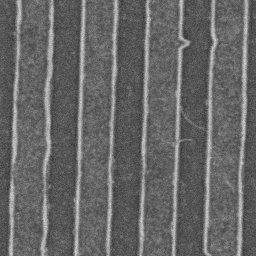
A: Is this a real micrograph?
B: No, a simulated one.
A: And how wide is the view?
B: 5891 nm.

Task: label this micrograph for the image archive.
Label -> one or a few lines or trenches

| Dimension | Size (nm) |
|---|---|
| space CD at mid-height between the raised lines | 742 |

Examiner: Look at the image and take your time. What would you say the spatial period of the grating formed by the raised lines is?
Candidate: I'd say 1500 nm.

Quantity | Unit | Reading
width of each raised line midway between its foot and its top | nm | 742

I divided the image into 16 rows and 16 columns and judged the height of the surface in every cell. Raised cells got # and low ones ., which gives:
.##..##..##..##.
.##..##..##..##.
.##..##..##..##.
.##..##..##..##.
.##..##..##..##.
.##..##..##..##.
.##..##..##..##.
.##..##..##..##.
.##..##..##..##.
.##..##..##..##.
.##..##..##..##.
.##..##..##..##.
.##..##..##..##.
.##..##..##..##.
.##..##..##..##.
.##..##..##..##.